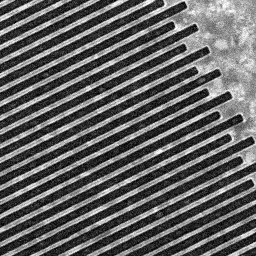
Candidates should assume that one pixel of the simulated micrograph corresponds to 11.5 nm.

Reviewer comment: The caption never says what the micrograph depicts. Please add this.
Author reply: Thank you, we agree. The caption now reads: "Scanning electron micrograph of parallel lines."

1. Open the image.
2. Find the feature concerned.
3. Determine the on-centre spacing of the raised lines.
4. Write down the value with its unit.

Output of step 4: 145 nm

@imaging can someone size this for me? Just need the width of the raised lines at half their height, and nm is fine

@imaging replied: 38.6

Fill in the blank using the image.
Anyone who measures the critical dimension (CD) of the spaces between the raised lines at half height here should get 107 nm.